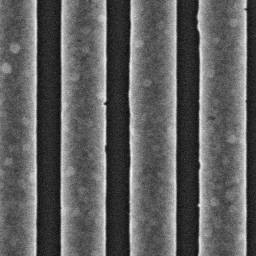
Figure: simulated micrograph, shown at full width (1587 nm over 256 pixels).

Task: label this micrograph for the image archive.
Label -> one or a few lines or trenches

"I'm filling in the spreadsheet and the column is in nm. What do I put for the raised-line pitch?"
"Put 431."